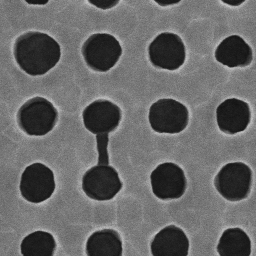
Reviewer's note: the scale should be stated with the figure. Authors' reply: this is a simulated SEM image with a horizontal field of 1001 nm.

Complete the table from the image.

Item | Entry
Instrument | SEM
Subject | a regular array of holes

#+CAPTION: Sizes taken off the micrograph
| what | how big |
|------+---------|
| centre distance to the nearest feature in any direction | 253 nanometres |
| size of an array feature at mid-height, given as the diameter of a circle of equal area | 143 nanometers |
